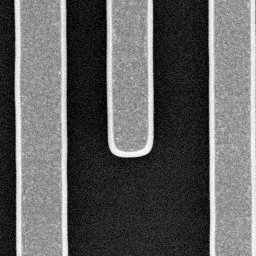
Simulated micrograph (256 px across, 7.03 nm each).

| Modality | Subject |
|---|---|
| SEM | groups of lines, slits or small figures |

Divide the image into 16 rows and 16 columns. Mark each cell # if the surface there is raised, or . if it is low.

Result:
.###...##....###
.###...##....###
.###...##....###
.###...##....###
.###...##....###
.###...##....###
.###...##....###
.###...##....###
.###...##....###
.###...##....###
.###.........###
.###.........###
.###.........###
.###.........###
.###.........###
.###.........###